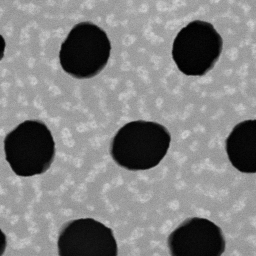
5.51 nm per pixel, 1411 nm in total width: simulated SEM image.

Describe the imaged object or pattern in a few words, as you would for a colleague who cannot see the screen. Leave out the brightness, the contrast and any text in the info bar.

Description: holes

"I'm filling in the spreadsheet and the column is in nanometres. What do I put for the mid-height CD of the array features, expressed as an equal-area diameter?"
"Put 285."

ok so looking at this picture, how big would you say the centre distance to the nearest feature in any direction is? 609 nanometres